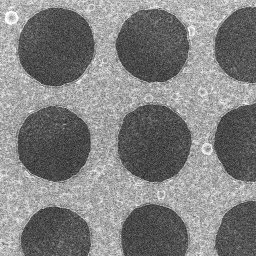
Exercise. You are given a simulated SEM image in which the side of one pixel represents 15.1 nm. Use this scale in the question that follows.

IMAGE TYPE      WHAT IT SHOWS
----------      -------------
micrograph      raised bodies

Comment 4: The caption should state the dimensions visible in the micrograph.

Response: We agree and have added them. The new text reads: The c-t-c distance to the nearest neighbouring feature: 1460 nm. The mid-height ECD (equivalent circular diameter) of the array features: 1150 nanometres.